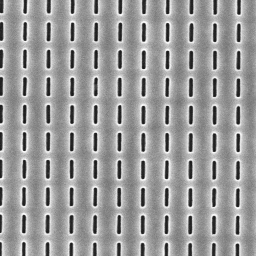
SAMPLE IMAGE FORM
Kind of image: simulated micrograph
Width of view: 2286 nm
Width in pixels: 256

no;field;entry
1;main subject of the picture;a regular array of holes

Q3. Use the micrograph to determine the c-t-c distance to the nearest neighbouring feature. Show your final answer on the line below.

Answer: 211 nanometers